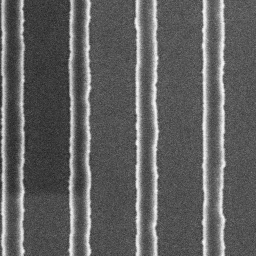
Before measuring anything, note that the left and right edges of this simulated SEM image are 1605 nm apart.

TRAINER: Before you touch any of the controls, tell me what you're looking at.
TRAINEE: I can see lines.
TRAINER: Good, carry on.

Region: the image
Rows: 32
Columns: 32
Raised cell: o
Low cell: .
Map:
ooo......oo......oo......ooo....
ooo......oo......oo......ooo....
ooo......oo......ooo.....ooo....
ooo......oo......ooo.....ooo....
ooo......oo......oo......ooo....
ooo......oo......ooo.....ooo....
ooo......oo......ooo.....ooo....
ooo......oo......ooo.....ooo....
ooo......oo......ooo.....ooo....
ooo......oo......ooo.....ooo....
ooo......oo......oo......ooo....
ooo......oo......oo......ooo....
ooo......oo......oo......ooo....
ooo......oo......ooo.....ooo....
ooo......oo......ooo.....ooo....
ooo......oo......ooo.....ooo....
ooo......oo......ooo.....ooo....
ooo......oo......ooo.....ooo....
ooo......oo......ooo.....ooo....
ooo......oo......oo......ooo....
ooo......oo......oo......ooo....
ooo......oo......ooo.....ooo....
ooo......oo......ooo.....ooo....
ooo......oo......ooo.....ooo....
ooo......oo......ooo......oo....
ooo......oo......ooo.....ooo....
ooo......oo......ooo.....ooo....
ooo......oo......ooo.....ooo....
ooo......oo......oo......ooo....
ooo......oo......ooo.....ooo....
ooo......oo......ooo.....ooo....
ooo......oo......ooo.....ooo....